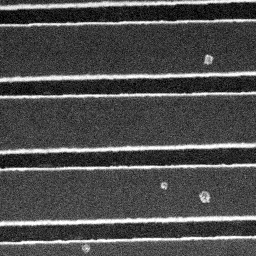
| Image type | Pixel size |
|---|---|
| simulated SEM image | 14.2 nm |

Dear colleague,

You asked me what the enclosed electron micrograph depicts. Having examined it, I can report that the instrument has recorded lines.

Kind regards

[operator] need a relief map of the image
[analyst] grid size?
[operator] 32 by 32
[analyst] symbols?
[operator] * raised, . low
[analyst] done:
*************...................
................................
................................
********************************
********************************
********************************
********************************
********************************
********************************
*****************.**............
................................
................................
********************************
********************************
********************************
********************************
********************************
********************************
*********************...........
................................
................................
********************************
********************************
********************************
********************************
********************************
********************************
*********************...........
................................
................................
********************************
********************************